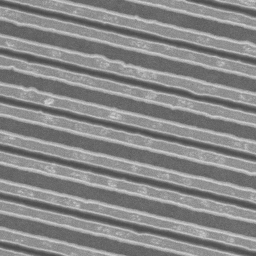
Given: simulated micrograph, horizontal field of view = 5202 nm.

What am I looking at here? parallel lines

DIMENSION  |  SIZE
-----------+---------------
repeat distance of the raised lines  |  0.479 um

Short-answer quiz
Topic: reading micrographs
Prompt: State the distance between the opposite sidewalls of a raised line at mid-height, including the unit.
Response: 248 nanometers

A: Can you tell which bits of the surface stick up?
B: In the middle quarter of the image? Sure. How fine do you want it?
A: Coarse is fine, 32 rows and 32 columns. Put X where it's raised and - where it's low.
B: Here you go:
----XXXXXXXXXXXXX---------------
--------XXXXXXXXXXXXX-----------
XXXXX--------XXXXXXXXXXXXX------
XXXXXXXXX---------XXXXXXXXXXXXX-
-XXXXXXXXXXXX--------XXXXXXXXXXX
----XXXXXXXXXXXXXX-------XXXXXXX
---------XXXXXXXXXXXXX--------XX
-------------XXXXXXXXXXXXX------
X----------------XXXXXXXXXXXXXX-
XXXXX-----------------XXXXXXXXXX
XXXXXXXXX-----------------XXXXXX
XXXXXXXXXXXXX------------------X
----XXXXXXXXXXXXX---------------
X-------XXXXXXXXXXXXXX----------
XXXXX-------XXXXXXXXXXXXXX------
XXXXXXXXXX-------XXXXXXXXXXXXX--
XXXXXXXXXXXXX--------XXXXXXXXXXX
----XXXXXXXXXXXXXXX------XXXXXXX
---------XXXXXXXXXXXXX--------XX
-------------XXXXXXXXXXXXX------
-----------------XXXXXXXXXXXXXX-
XXXX------------------XXXXXXXXXX
XXXXXXX-------------------XXXXXX
XXXXXXXXXXXXX-----------------XX
----XXXXXXXXXXXXX---------------
---------XXXXXXXXXXXX-----------
XXXX--------XXXXXXXXXXXXX-------
XXXXXXXX---------XXXXXXXXXXXX---
XXXXXXXXXXXX----------XXXXXXXXXX
-----XXXXXXXXXXXX---------XXXXXX
---------XXXXXXXXXXXXX--------XX
-------------XXXXXXXXXXXXX------